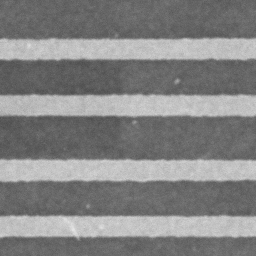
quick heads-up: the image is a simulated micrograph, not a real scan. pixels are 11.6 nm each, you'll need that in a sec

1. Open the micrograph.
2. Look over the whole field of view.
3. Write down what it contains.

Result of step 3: lines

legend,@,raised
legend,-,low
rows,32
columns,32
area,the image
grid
--------------------------------
--------------------------------
--------------------------------
--------------------------------
--------------------------------
@@@@@@@@@@@@@@@@@@@@@@@@@@@@@@@@
@@@@@@@@@@@@@@@@@@@@@@@@@@@@@@@@
--------------------------------
--------------------------------
--------------------------------
--------------------------------
--------------------------------
@@@@@@@@@@@@@@@@@@@@@@@@@@@@@@@@
@@@@@@@@@@@@@@@@@@@@@@@@@@@@@@@@
--------------------------------
--------------------------------
--------------------------------
--------------------------------
--------------------------------
--------------------------------
@@@@@@@@@@@@@@@@@@@@@@@@@@@@@@@@
@@@@@@@@@@@@@@@@@@@@@@@@@@@@@@@@
@@@@@-@@@-@@--@@@@@@-@--@@@@----
--------------------------------
--------------------------------
--------------------------------
--------------------------------
@@@@@@@@@@@@@@@@@@@@@@@@@@@@@@@@
@@@@@@@@@@@@@@@@@@@@@@@@@@@@@@@@
@--------@@@------@@--@---@@-@--
--------------------------------
--------------------------------